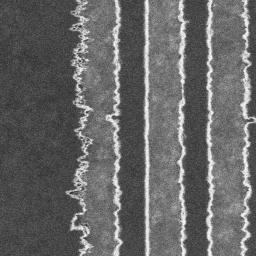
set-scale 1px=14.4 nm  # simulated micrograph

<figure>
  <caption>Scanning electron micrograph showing one or a few lines or trenches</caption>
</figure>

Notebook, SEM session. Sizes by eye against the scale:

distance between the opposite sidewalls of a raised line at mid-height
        0.424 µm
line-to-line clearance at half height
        501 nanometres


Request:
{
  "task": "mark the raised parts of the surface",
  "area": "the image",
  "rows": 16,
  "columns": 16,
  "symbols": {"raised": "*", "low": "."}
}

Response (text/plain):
*****..**..**..*
*****..**..**..*
*****..**..**..*
*****..**..**..*
*****..**..**..*
*****..**..**..*
*****..**..**..*
*****..**..**..*
*****..**..**..*
*****..**..**..*
*****..**..**..*
*****..**..**..*
*****..**..**..*
*****..**..**..*
*****..**..**..*
*****..**..**..*